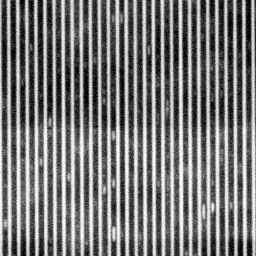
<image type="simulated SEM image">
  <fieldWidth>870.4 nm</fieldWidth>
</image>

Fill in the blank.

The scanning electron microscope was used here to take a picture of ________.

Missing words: parallel lines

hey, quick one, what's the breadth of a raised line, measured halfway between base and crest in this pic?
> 6.4 nm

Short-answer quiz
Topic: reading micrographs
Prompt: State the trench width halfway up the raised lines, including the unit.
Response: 22.1 nm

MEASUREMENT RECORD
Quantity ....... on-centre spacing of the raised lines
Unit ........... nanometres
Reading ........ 30.7